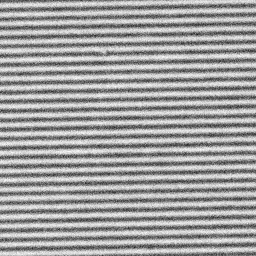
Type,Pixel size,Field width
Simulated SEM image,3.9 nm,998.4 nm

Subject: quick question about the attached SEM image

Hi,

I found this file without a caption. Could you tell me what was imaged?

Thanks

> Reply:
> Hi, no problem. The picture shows parallel lines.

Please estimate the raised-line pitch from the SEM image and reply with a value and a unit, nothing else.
35.9 nm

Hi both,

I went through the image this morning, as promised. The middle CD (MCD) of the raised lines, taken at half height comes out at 16.6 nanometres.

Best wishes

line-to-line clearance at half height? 19.5 nm